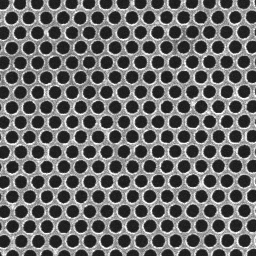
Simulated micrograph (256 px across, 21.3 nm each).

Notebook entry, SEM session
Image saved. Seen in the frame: a regular array of holes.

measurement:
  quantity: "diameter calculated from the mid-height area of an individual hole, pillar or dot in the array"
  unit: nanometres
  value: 279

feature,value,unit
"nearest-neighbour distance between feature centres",356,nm